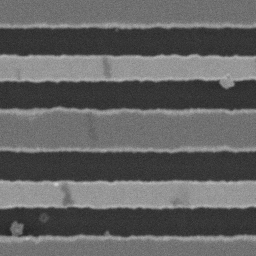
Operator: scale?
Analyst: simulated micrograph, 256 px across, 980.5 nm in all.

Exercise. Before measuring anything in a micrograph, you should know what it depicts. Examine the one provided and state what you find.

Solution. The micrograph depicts lines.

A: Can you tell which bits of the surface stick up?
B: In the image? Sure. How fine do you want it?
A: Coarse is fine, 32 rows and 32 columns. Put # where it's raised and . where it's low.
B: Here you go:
################################
################################
################################
...#...........###..............
................................
................................
................................
################################
################################
################################
............................#...
................................
................................
.......#........................
################################
################################
################################
################################
################################
................................
................................
................................
................................
################################
################################
################################
................................
................................
..#.............................
.....##..###.#..#.#.....#..#.###
################################
################################